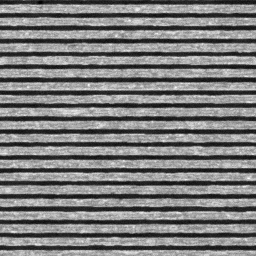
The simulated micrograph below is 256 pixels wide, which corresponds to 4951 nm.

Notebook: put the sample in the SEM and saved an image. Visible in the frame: parallel lines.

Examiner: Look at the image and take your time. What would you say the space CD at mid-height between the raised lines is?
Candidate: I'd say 102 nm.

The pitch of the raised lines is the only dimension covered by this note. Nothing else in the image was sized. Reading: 250 nm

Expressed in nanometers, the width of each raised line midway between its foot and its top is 138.